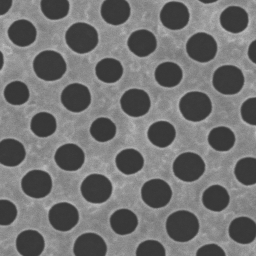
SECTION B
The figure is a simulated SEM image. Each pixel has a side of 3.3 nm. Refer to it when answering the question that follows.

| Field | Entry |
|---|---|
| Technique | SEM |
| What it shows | a regular array of holes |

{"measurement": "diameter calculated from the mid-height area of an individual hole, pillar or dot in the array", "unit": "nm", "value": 95.6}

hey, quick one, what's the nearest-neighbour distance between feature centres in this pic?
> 137 nanometers